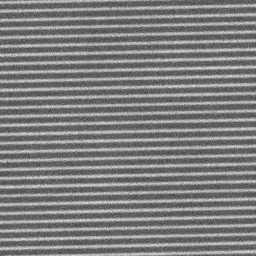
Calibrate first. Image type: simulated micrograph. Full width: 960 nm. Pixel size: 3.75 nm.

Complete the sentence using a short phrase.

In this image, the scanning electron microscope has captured parallel lines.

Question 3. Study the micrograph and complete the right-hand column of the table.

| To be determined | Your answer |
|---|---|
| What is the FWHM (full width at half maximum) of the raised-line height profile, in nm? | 9.4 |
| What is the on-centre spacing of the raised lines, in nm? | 32.9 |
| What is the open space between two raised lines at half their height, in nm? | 25.3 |